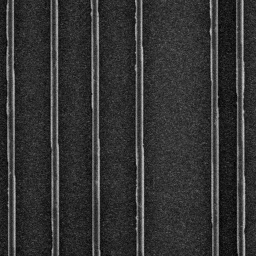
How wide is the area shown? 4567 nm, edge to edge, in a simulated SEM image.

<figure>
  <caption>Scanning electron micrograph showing lines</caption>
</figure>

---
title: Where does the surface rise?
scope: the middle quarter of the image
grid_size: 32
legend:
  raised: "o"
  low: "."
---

.......oo.........oo............
.......oo.........oo............
.......oo.........oo............
.......oo.........oo............
.......oo.........oo............
.......oo.........oo............
.......oo.........oo............
.......oo.........oo............
.......oo.........oo............
.......oo.........oo............
.......oo.........oo............
.......oo.........oo............
.......oo.........oo............
.......oo.........oo............
.......oo.........oo............
.......oo.........oo............
.......oo.........oo............
.......oo.........oo............
.......oo.........oo............
.......oo.........oo............
.......oo.........oo............
.......oo.........oo............
.......oo.........oo............
.......oo.........oo............
.......oo.........oo............
.......oo.........oo............
.......oo.........oo............
.......oo.........oo............
.......oo.........oo............
.......oo.........oo............
.......oo.........oo............
.......oo.........oo............